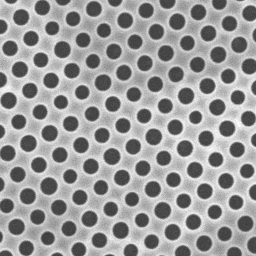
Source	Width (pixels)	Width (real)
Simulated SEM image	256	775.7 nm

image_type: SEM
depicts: a regular array of holes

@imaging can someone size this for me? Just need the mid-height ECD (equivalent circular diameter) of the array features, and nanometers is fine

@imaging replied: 50.3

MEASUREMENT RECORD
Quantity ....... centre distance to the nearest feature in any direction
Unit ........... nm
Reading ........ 69.9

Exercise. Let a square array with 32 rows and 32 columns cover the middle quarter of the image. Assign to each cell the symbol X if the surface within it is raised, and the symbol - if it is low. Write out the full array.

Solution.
----XX---XXXXX--XX----XXXXXXXXX-
----XXXXXXXXX----XX--XXXXX----XX
----XXXXXXXXX----XXXXXXXXX----XX
X--XXXXX----X----XXXX---XX----XX
XXXXXXX-----XXXXXXXXX----XX--XXX
XXXX--XX----XXXXXXXXX----XXXXXXX
XXX---XX---XXXXX---XX---XXXXX---
XXX---XXXXXXXXX----XXXXXXXXX----
-XX---XXXXX---XX---XXXXXX-XX----
-XXXXXXXXX----XXX-XXXXXX---XX---
-XXXXXXXXX----XXXXXXXXX----XXXXX
XXXXX----XX---XXXXX--XXX---XXXXX
XXXXX----XXXXXXXXX----XXX-XXXXX-
---XX----XXXXX--XX----XXXXXXXXX-
----XXXXXXXXX----XX--XXXXX---XX-
----XXXXXXXXX----XXXXXXXXX----XX
---XXXXX---XX---XXXXX---XX----XX
XXXXXXX-----XX-XXXXX-----X---XXX
XXX--XX----XXXXXXXXX-----XXXXXXX
XX----XX---XXXXX---XX---XXXXX---
XX----XXXXXXXXX----XXX-XXXXX----
-XX---XXXXX--XX----XXXXXXXXX----
-XXXXXXXXX----XX--XXXXX----X----
-XXXXX-XXX----XXXXXXXXX----XXXXX
XXXXX----X----XXXX---XX----XXXXX
XXXXX----XXXXXXXXX----XX-XXXXXX-
X--XX----XXXXX--XX----XXXXXXXXX-
---XXX--XXXXX---XX---XXXXX---XX-
---XXXXXXXXX-----XXXXXXXX----XXX
---XXXXX---XX---XXXXX--XX----XXX
XXXXXXX----XXX-XXXXX----XX---XXX
XXX--XX----XXXXXXXXX----XXXXXXXX